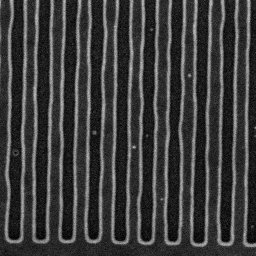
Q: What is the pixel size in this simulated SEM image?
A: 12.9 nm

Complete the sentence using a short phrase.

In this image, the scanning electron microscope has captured groups of lines, slits or small figures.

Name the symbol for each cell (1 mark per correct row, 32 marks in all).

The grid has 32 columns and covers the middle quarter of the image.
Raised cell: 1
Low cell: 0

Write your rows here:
00001100001110000110000111000011
00011100001110000110000111000011
00011100001110000110000111000011
00011100001110000110000111000011
00011100001110000110000111000011
00011100001110000110000111000011
00011100001110001110000111000011
00011100001110001110000111000011
00011100001110001110000111000011
00011100001110001111000111000011
00011100001110001111000111000011
00011100001110001110000111000011
00011100001110001110000111000111
00011100001110001110000111000111
00011100001110001110000111000111
00011100001110001110000111000111
00011100001110001110000111000111
00011100001110001110000111000111
00011100001110001110000111000111
00011100011110001110000111000111
00011100011110001110000111000111
00011100011100001110000111000111
00011100011100001110000111000111
00011100011100001110000111000011
00011100001100001110000110000111
00011100001100001110000110000111
00011100001100001110000110000111
00011100011100001110000110000111
00011100011100001110000110000111
00011100011100001110000110000111
00011100011100001110000111000111
00011100011100001110000111000111